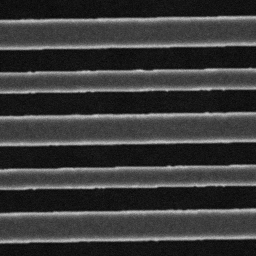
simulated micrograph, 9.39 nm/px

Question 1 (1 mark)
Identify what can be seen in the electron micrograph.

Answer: lines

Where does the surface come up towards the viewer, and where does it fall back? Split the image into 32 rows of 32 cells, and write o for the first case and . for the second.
................................
................................
......oooooooooooooooooooooooooo
oooooooooooooooooooooooooooooooo
oooooooooooooooooooooooooooooooo
oooooooooooooooooooooooooooooooo
................................
................................
................................
oooooooooooooooooooooooooooooooo
oooooooooooooooooooooooooooooooo
oooo............................
................................
................................
.........ooooooooooooooooooooooo
oooooooooooooooooooooooooooooooo
oooooooooooooooooooooooooooooooo
oooooooooooooooooooooooooooooooo
................................
................................
................................
oooooooooooooooooooooooooooooooo
oooooooooooooooooooooooooooooooo
ooooooooooooo...................
................................
................................
................o.oooooooooooooo
oooooooooooooooooooooooooooooooo
oooooooooooooooooooooooooooooooo
oooooooooooooooooooooooooooooooo
................................
................................